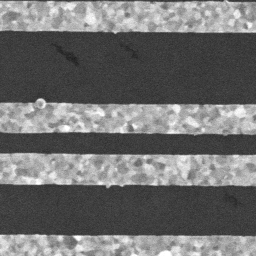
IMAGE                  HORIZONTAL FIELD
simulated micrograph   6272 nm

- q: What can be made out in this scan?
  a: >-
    wiring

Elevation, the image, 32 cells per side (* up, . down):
********************************
********************************
********************************
********************************
................................
................................
................................
................................
................................
................................
................................
................................
................................
********************************
********************************
********************************
..............******************
................................
................................
**********************..***...**
********************************
********************************
********************************
................................
................................
................................
................................
................................
................................
*******.........................
********************************
********************************